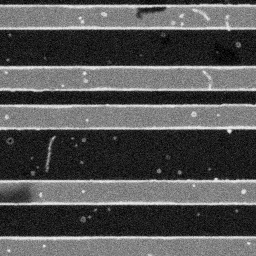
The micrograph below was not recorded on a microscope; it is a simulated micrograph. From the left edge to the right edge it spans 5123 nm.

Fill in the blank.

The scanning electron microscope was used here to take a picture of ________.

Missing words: lines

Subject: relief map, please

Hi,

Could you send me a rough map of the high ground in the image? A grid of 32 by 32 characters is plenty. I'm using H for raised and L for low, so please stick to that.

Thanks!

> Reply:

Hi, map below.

LLLLLLLLLLLLLLLLLLLLLLLLLLLLLLLL
HHHHHHHHHHHHHHHHHHHHHHHHHHHHHHHH
HHHHHHHHHHHHHHHHHHHHHHHHHHHHHHHH
HHHHHLLLLLLLLLLLLLLLLLLHHHLLHHHL
LLLLLLLLLLLLLLLLLLLLLLLLLLLLLLLL
LLLLLLLLLLLLLLLLLLLLLLLLLLLLLLLL
LLLLLLLLLLLLLLLLLLLLLLLLLLLLLLLL
LLLLLLLLLLLLLLLLLLLLLLLLLLLLLLLL
HHHHHHHHHHHHHHHHHHHHHHHHHHHHHHHH
HHHHHHHHHHHHHHHHHHHHHHHHHHHHHHHH
HHHHHHHHHHHHHHHHHHHHHHHHHHHHHHHH
LLLLLLLLLLLLLLLLLLLLLLLLLLLLLLLL
LLLLLLLLLLLLLLLLLLLLLLLLLLLLLLLL
HHHHHHHHHHHHHHHHHHHHHHHHHHHHHHHH
HHHHHHHHHHHHHHHHHHHHHHHHHHHHHHHH
HHHHHHHHHHHHHHHHHHHHHHHHHHHHHHHH
LLLLLLLLLLLLLLLLLLLLLLLLLLLLLLLL
LLLLLLLLLLLLLLLLLLLLLLLLLLLLLLLL
LLLLLLLLLLLLLLLLLLLLLLLLLLLLLLLL
LLLLLLLLLLLLLLLLLLLLLLLLLLLLLLLL
LLLLLLLLLLLLLLLLLLLLLLLLLLLLLLLL
LLLLLLLLLLLLLLLLLLLLLLLLLLLLLLLL
LLLLLLLLLLLLLLLLLLLLLLLLLLLLLLLL
HHHHHHHHHHHHHHHHHHHHHHHHHHHHHHHH
HHHHHHHHHHHHHHHHHHHHHHHHHHHHHHHH
HHHHLLLLLLLLHLLLLLLLLLHHHHHLLLLL
LLLLLLLLLLLLLLLLLLLLLLLLLLLLLLLL
LLLLLLLLLLLLLLLLLLLLLLLLLLLLLLLL
LLLLLLLLLLLLLLLLLLLLLLLLLLLLLLLL
LLLLLLLLLLLLLLLLLLLLLLLLLLLLLLLL
HHHHHHHHHHHHHHHHHHHHHHHHHHHHHHHH
HHHHHHHHHHHHHHHHHHHHHHHHHHHHHHHH